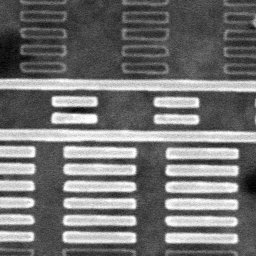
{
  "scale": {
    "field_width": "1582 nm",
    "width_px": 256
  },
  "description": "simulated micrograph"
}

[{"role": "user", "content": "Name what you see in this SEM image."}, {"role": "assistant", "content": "wiring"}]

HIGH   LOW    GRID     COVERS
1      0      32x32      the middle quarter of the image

00000000000000011111111111000000
00000000000000011111111111000000
00000000000000000000000000000000
00000000000000000000000000000000
11111111111111111111111111111111
11111111111111111111111111111111
00000000000000000000000000000000
00000000000000000000000000000000
11111111000000000000000000000000
11111111000000000000000111111111
00000000000000000000000001111111
00000000000000000000000000000000
00000000000000000000000000000000
11111111000000000000000111111111
11111111000000000000000111111111
00000000000000000000000000000000
00000000000000000000000000000000
11111111111111111111111111111111
11111111111111111111111111111111
00000000000000000000000000000000
00000000000000000000000000000000
11111111111111111100000000111111
11111111111111111100000000111111
00000000000000000000000000000000
00000000000000000000000000000000
11111111111111111000000000111111
11111111111111111100000000111111
00000000000000000000000000111111
00000000000000000000000000000000
01111000000000000000000000000000
11111111111111111100000000111111
01111111111111111000000000111111